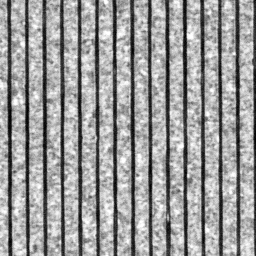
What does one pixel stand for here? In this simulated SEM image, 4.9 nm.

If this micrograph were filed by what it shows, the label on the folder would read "parallel lines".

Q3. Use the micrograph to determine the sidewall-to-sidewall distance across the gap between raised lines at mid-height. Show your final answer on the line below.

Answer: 0.0214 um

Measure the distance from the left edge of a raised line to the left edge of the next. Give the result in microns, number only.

0.0861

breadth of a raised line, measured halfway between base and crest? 63.7 nanometers